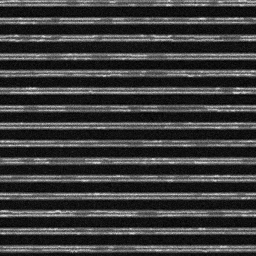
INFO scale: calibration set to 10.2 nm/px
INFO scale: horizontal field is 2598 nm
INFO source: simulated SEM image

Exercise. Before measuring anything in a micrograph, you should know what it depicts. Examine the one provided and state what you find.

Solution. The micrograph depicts parallel lines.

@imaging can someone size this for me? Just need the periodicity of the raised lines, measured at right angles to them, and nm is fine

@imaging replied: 178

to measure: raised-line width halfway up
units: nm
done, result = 63.4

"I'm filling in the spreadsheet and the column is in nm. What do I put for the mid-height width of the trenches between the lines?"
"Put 118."